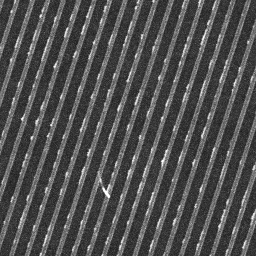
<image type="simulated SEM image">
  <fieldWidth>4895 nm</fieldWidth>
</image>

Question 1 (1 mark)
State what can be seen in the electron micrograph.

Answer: parallel lines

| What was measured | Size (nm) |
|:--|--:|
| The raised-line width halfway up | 77.3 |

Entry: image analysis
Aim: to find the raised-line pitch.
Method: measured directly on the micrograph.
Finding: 0.281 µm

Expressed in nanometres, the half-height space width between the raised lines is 200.